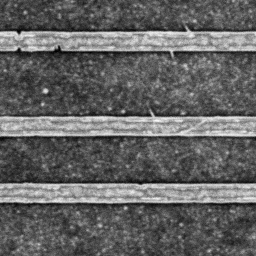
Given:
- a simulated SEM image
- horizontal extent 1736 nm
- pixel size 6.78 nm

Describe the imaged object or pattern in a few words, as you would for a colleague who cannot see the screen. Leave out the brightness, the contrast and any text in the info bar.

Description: one or a few lines or trenches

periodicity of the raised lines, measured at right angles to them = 0.514 µm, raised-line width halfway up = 120 nanometres